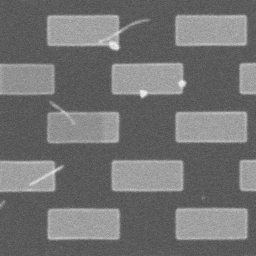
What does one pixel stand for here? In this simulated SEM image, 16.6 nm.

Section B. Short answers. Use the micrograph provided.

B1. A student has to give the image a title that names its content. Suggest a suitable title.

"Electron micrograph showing groups of lines, slits or small figures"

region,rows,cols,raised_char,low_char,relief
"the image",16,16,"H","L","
LLLLLLLLLLLLLLLL
LLLHHHHLLLLHHHHL
LLLHHHHLLLLHHHHL
LLLLLLLLLLLLLLLL
HHHLLLLHHHHLLLLH
HHHLLLLHHHHLLLLH
LLLLLLLLLLLLLLLL
LLLHHHHLLLLHHHHL
LLLHHHHLLLLHHHHL
LLLLLLLLLLLLLLLL
HHHLLLLHHHHLLLLH
HHHLLLLHHHHLLLLH
LLLLLLLLLLLLLLLL
LLLHHHHLLLLHHHHL
LLLHHHHLLLLHHHHL
LLLLLLLLLLLLLLLL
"